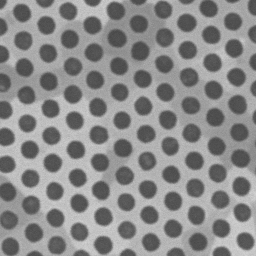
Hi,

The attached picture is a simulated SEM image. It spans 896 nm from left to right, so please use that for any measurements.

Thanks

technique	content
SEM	a regular array of holes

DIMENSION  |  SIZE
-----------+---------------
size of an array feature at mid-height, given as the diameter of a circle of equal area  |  67.2 nanometers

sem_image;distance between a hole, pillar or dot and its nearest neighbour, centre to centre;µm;0.0913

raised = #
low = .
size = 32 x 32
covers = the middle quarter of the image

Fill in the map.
.....######.....#######....#####
....########....##..###....##...
#...##...####..###....#######...
#####.....#######.....#######...
#####.....########....#######...
#..###....##...###...##....###..
....########....#######.....####
.....#######....#######.....####
....###..###....###..###...###..
#...##....########....###.###...
######.....######.....#######...
######.....#######....########..
#...###...###...##...###....###.
.....#######.....#######....####
.....#######.....#######....####
#....##..####....##...##....##..
##..###....###.###.....##.####..
######.....#######.....######...
######.....#######.....##...##..
##..###...###....##...##....###.
#....#######.....#######.....###
.....#######.....########....###
#....###..###....##...###...###.
##..###....########....#######..
######.....#######.....#######..
#######....########....###..###.
##...###...##....###..###....###
#....########....########....###
#.....#######.....#######....###
#.....##..###....##...####..###.
##...##....########....#######..
#######....########....########.